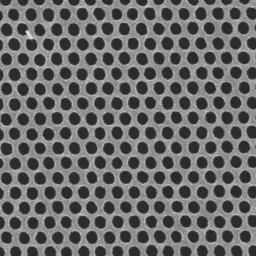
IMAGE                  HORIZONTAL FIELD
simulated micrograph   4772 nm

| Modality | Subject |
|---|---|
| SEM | a regular array of holes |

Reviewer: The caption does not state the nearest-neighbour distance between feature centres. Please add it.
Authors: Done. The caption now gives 308 nanometres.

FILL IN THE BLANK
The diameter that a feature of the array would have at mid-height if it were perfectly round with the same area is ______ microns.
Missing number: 0.233